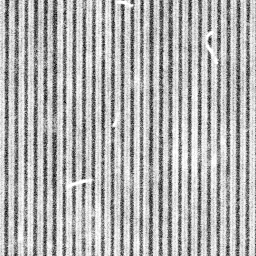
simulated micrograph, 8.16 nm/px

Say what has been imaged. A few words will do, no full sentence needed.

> parallel lines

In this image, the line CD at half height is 0.0347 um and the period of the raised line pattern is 78.8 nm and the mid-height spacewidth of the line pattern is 5.12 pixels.